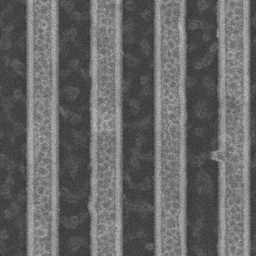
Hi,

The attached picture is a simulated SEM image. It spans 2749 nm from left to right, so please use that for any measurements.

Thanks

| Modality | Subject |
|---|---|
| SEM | one or a few lines or trenches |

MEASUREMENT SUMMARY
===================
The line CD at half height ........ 247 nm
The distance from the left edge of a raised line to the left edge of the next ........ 686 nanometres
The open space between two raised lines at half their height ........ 0.439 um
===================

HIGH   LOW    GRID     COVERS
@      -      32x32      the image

----@@@-----@@@-----@@@-----@@@-
----@@@-----@@@-----@@@-----@@@-
----@@@-----@@@-----@@@-----@@@-
----@@@-----@@@-----@@@-----@@@-
----@@@-----@@@-----@@@-----@@@-
----@@@-----@@@-----@@@-----@@@-
----@@@-----@@@-----@@@-----@@@-
----@@@-----@@@-----@@@-----@@@-
----@@@-----@@@-----@@@-----@@@-
----@@@-----@@@-----@@@-----@@@-
----@@@-----@@@-----@@@-----@@@-
----@@@-----@@@-----@@@-----@@@-
----@@@-----@@@-----@@@-----@@@-
----@@@-----@@@-----@@@-----@@@-
----@@@-----@@@-----@@@-----@@@-
----@@@-----@@@-----@@@-----@@@-
----@@@-----@@@-----@@@-----@@@-
----@@@-----@@@-----@@@-----@@@-
----@@@-----@@@-----@@@-----@@@-
----@@@-----@@@-----@@@----@@@@-
----@@@-----@@@-----@@@-----@@@-
----@@@-----@@@-----@@@-----@@@-
----@@@-----@@@-----@@@-----@@@-
----@@@-----@@@-----@@@-----@@@-
----@@@-----@@@-----@@@-----@@@-
----@@@-----@@@-----@@@-----@@@-
----@@@-----@@@-----@@@-----@@@-
----@@@-----@@@-----@@@-----@@@-
----@@@-----@@@-----@@@-----@@@-
----@@@-----@@@-----@@@-----@@@-
----@@@-----@@@-----@@@-----@@@-
----@@@-----@@@-----@@@-----@@@-